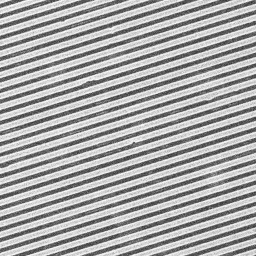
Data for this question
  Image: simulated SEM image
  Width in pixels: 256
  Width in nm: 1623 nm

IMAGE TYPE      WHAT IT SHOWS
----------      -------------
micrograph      parallel lines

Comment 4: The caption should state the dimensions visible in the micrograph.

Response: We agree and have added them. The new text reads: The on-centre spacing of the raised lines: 0.0646 µm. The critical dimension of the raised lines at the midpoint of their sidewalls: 32.6 nanometres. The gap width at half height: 32.6 nm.